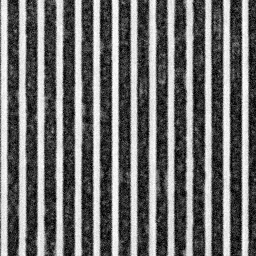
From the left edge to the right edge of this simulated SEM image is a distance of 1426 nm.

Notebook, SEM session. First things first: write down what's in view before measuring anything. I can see parallel lines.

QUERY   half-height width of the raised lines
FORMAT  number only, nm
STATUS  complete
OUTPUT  32.7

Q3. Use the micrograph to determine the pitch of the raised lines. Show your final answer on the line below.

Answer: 104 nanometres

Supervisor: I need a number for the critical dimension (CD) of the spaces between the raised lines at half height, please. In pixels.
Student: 12.8